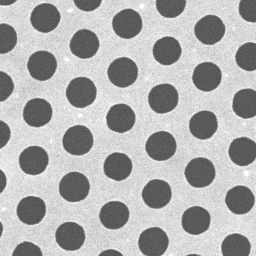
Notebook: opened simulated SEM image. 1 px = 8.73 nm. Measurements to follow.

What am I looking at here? a regular array of holes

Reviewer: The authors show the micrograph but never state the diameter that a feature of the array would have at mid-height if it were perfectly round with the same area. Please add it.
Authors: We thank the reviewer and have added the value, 261 nanometers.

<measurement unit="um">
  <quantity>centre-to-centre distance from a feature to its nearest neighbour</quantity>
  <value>0.411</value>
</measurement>